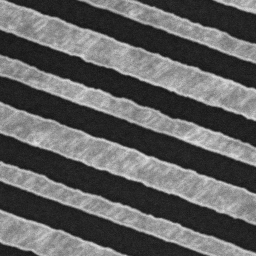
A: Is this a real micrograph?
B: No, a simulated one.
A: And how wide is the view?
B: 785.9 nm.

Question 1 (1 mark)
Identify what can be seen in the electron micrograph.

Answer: lines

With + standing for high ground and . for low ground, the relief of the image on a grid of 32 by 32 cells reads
++..........++++++..........++++
+++++.........+++++++..........+
++++++++.........++++++.........
++++++++++..........++++++......
..+++++++++++.........+++++++...
.....+++++++++++.........++++++.
........+++++++++++.........++++
++.........++++++++++..........+
++++..........+++++++++++.......
.++++++.........+++++++++++.....
...+++++++.........+++++++++++..
......+++++++.........++++++++++
.........+++++++........++++++++
++..........+++++++.........++++
+++++..........++++++.........++
++++++++.........+++++++........
++++++++++..........+++++++.....
..+++++++++++..........++++++...
.....+++++++++++.........+++++++
........+++++++++++..........+++
+..........+++++++++++.........+
++++..........++++++++++........
++++++...........++++++++++.....
...++++++..........+++++++++++..
.....+++++++..........++++++++++
........+++++++..........+++++++
+..........+++++++.........+++++
+++...........+++++++.........++
++++++...........++++++.........
+++++++++..........+++++++......
++++++++++++..........+++++++...
....++++++++++...........++++++.